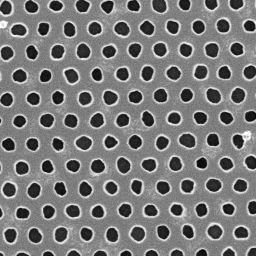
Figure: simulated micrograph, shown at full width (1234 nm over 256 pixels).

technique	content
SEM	a regular array of holes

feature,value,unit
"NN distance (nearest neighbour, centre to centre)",0.12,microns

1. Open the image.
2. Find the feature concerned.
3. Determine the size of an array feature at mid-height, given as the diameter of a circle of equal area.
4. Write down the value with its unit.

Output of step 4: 0.0642 um